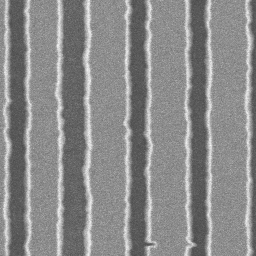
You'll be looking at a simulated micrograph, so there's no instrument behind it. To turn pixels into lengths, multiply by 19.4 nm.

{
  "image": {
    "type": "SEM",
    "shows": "parallel lines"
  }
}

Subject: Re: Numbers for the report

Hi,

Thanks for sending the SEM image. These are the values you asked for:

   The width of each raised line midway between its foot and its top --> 824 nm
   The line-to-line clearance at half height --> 356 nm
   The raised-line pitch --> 61.7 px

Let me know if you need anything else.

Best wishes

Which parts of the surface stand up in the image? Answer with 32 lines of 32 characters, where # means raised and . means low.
#..#####...#####..######..#####.
#..#####...#####..######..#####.
#..#####...#####..######..#####.
#..#####...#####..######..#####.
#..#####...#####..######..#####.
#..#####...#####..######..#####.
#..#####...#####..######..#####.
#..#####...#####..######..#####.
#..#####...#####...#####..#####.
#..#####...#####..######..#####.
#..####....#####...#####..#####.
#..####....#####...#####..#####.
#..#####...#####..######..#####.
#..#####...#####..######..#####.
#...####...#####..######..#####.
#..#####...#####..######..#####.
#..#####...#####..######..#####.
#..#####...#####..######..#####.
#..#####...#####...#####..#####.
#..#####...#####..######..#####.
#..#####...#####..######..#####.
#..#####...#####..######..#####.
#..#####...#####..######..#####.
#..#####...#####..######..#####.
#..#####...#####..######..#####.
#..#####...#####..######..#####.
#..#####...#####..######..#####.
#..#####...#####..######..#####.
#..#####...#####..######..#####.
#..#####...#####..######..#####.
#..#####...#####...#####..#####.
#..####....#####..######..#####.